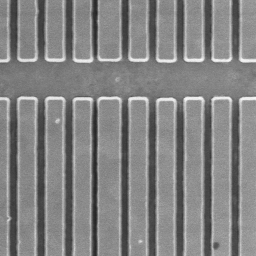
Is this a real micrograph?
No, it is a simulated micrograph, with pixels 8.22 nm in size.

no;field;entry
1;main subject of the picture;parallel lines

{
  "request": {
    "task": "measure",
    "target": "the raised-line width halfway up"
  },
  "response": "154 nanometres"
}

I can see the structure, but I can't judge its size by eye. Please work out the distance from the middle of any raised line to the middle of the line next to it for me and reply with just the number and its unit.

27.7 pixels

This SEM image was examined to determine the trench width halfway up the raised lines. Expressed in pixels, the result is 8.88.